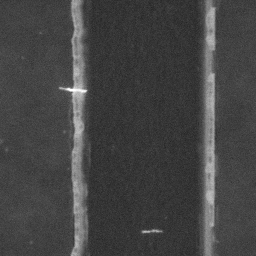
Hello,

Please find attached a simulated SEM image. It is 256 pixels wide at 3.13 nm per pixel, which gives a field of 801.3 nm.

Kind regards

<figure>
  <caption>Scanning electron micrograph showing one or a few lines or trenches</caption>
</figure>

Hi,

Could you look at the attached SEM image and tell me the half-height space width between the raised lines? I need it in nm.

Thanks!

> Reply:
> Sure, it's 399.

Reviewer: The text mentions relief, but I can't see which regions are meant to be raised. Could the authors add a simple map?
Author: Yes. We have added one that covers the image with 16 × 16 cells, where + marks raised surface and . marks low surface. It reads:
+++++........+++
+++++........+++
+++++........+++
+++++........+++
+++++........+++
+++++........+++
+++++........+++
+++++........+++
+++++........+++
+++++........+++
+++++........+++
+++++........+++
+++++........+++
+++++........+++
+++++........+++
+++++........+++